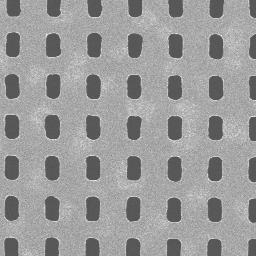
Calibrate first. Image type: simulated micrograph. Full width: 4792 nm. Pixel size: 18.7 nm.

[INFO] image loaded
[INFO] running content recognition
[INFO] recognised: a regular array of holes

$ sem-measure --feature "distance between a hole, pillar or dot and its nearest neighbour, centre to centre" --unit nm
756